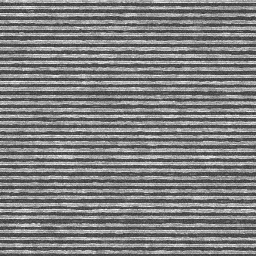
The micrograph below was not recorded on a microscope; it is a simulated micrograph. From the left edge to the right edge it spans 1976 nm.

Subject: parallel lines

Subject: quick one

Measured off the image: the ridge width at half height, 20.3 nanometres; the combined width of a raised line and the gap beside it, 0.0524 micrometres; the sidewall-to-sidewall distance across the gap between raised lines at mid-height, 30.9 nanometers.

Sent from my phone